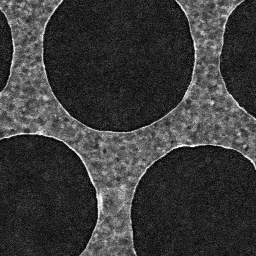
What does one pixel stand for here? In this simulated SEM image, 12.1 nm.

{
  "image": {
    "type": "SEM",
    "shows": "holes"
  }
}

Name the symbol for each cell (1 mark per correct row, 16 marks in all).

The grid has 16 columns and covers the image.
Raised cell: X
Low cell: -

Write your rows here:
XXXX-------XXXX-
-XX---------XX--
-XX---------XX--
-XX---------XX--
-XX---------XX--
XXX---------XX--
XXXX-------XXXX-
XXXXX-----XXXXXX
X--XXXXXXXXXXXXX
-----XXXXXX----X
-----XXXX-------
------XXX-------
------XX--------
------XX--------
------XX--------
-----XXX--------